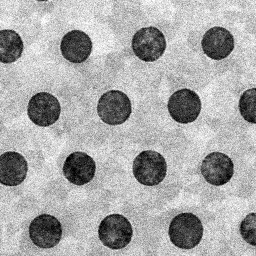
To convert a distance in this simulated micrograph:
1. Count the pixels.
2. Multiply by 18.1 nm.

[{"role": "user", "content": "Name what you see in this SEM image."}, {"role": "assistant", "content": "a regular array of holes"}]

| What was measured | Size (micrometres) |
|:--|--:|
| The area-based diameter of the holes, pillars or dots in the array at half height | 0.628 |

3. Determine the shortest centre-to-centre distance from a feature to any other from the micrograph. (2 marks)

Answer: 1250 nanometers